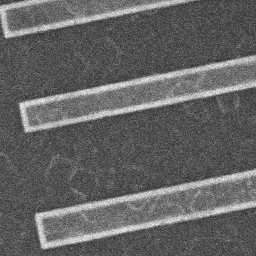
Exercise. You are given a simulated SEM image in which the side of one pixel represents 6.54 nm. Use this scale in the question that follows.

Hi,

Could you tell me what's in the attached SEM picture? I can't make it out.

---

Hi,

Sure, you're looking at one or a few lines or trenches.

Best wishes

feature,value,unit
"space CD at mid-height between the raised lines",558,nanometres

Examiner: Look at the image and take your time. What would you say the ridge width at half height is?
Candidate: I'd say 188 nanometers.